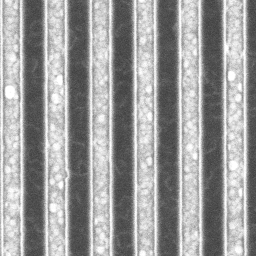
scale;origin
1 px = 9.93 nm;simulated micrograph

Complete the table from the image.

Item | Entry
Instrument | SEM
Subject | parallel lines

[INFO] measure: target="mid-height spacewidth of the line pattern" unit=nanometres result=186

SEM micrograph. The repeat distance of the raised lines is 444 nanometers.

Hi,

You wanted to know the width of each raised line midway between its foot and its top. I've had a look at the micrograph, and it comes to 262 nanometers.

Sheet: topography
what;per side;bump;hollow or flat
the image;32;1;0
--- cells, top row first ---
00011100111000111001110001110001
00011100111000111001110001110001
00011100111000111001111001110011
00011100111000111001111001110011
00011100111000111001111001110001
00011100111000111001110001110001
00011100111000111001111001110011
00011100111000111001111001110011
00011100111000111001111001110001
00011100111000111001111001111001
00011100111000111001111001110011
11011100111000111001111001110001
00011100111000111001111001110001
00011100111000111001111001110001
00011100111000111001111001110001
00011100111000111001111001110001
00011100111000111001111001110001
00011100111000111001111001110001
00011100111000111001111001110001
00011100111000111001111001110001
00011100111000111001111001110001
00011100111000111001111001110001
00011100111000111001111001110001
00011100111000111001111001110011
00011100111000111001111001110001
00011100111000111001111001110001
00011100111100111001111001110001
00011100111100111001111001110001
00011100111100111001111001110001
00011100111100111001111001110001
00011100111100111001111001110001
00011100111100111001111001110001